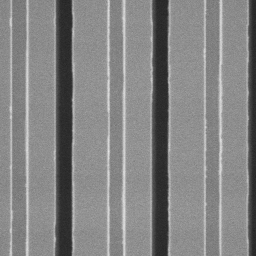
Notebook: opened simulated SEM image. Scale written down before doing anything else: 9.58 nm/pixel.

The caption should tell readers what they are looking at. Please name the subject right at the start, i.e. lines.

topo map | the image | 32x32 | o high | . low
ooooooo..oooooooooo..oooooooooo.
ooooooo..oooooooooo..oooooooooo.
ooooooo..oooooooooo..oooooooooo.
ooooooo..oooooooooo..oooooooooo.
ooooooo..oooooooooo..oooooooooo.
ooooooo..oooooooooo..oooooooooo.
ooooooo..oooooooooo..oooooooooo.
ooooooo..oooooooooo..oooooooooo.
ooooooo..oooooooooo..oooooooooo.
ooooooo..oooooooooo..oooooooooo.
ooooooo..oooooooooo..oooooooooo.
ooooooo..oooooooooo..oooooooooo.
ooooooo..oooooooooo..oooooooooo.
ooooooo..oooooooooo..oooooooooo.
ooooooo..oooooooooo..oooooooooo.
ooooooo..oooooooooo..oooooooooo.
ooooooo..oooooooooo..oooooooooo.
ooooooo..oooooooooo..oooooooooo.
ooooooo..oooooooooo..oooooooooo.
ooooooo..oooooooooo..oooooooooo.
ooooooo..oooooooooo..oooooooooo.
ooooooo..oooooooooo..oooooooooo.
ooooooo..oooooooooo..oooooooooo.
ooooooo..oooooooooo..oooooooooo.
ooooooo..oooooooooo..oooooooooo.
ooooooo..oooooooooo..oooooooooo.
ooooooo..oooooooooo..oooooooooo.
ooooooo..oooooooooo..oooooooooo.
ooooooo..oooooooooo..oooooooooo.
ooooooo..oooooooooo..oooooooooo.
ooooooo..oooooooooo..oooooooooo.
ooooooo..oooooooooo..oooooooooo.